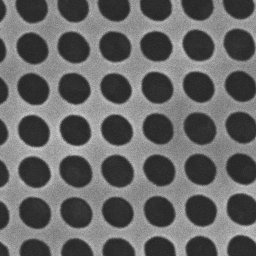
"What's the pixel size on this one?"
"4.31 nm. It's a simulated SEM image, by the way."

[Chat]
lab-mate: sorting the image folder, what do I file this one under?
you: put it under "a regular array of holes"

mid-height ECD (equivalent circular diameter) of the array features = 32.2 px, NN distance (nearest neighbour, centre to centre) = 41.2 px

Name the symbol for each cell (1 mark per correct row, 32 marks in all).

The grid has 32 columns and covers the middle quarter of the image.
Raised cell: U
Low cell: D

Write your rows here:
UUUUUUUUUUUUUUUUUUUUUUUUUUUUUUUU
UUUUUUUUUUUUUUUUUUUUUUUUUUUUUUUU
DDDDUUUUUUUDDDUUUUUUUDDDDUUUUUUD
DDDDDUUUUUDDDDDDUUUUDDDDDDUUUUDD
DDDDDDUUUDDDDDDDUUUDDDDDDDDUUUDD
DDDDDDDUUDDDDDDDDUUDDDDDDDDUUUDD
DDDDDDDUUDDDDDDDDUUDDDDDDDDDUUDD
DDDDDDDUUUDDDDDDDUUUDDDDDDDUUUUD
DDDDDDUUUUDDDDDDUUUUDDDDDDDUUUUD
UDDDDUUUUUUUDDDUUUUUUUDDDUUUUUUU
UUUUUUUUUUUUUUUUUUUUUUUUUUUUUUUU
UUUUUUUUUUUUUUUUUUUUUUUUUUUUUUUU
UUDUUUUUUUUUUUUUUUUUUUDDUUUUUUUD
DDDDDUUUUUDDDDDUUUUUDDDDDDUUUUDD
DDDDDDUUUDDDDDDDUUUUDDDDDDDUUUDD
DDDDDDUUUDDDDDDDDUUDDDDDDDDUUUDD
DDDDDDDUUDDDDDDDDUUUDDDDDDDDUUDD
DDDDDDDUUDDDDDDDDUUUDDDDDDDUUUDD
DDDDDDDUUUDDDDDDDUUUUDDDDDDUUUUD
DDDDDDUUUUUDDDDDUUUUUUDDDDUUUUUU
UUUDUUUUUUUUUUUUUUUUUUUUUUUUUUUU
UUUUUUUUUUUUUUUUUUUUUUUUUUUUUUUU
UUUUUUUUUUUUUDUUUUUUUUUUUUUUUUUU
DDDDDUUUUUDDDDDUUUUUUDDDDDUUUUUD
DDDDDDUUUUDDDDDDUUUUDDDDDDDUUUDD
DDDDDDDUUDDDDDDDDUUUDDDDDDDDUUDD
DDDDDDDUUDDDDDDDDDUUDDDDDDDDUUDD
DDDDDDDUUDDDDDDDDDUUDDDDDDDDUUDD
DDDDDDDUUUDDDDDDDUUUUDDDDDDDUUUD
DDDDDDDUUUUDDDDDDUUUUUDDDDDUUUUU
UUDDDDUUUUUUDDDDUUUUUUUUDUUUUUUU
UUUUUUUUUUUUUUUUUUUUUUUUUUUUUUUU